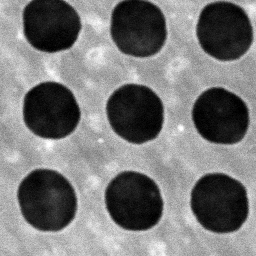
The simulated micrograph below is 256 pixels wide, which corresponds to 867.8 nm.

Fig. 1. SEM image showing holes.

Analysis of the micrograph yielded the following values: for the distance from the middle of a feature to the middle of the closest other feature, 290 nanometres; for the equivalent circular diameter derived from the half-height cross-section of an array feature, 202 nm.